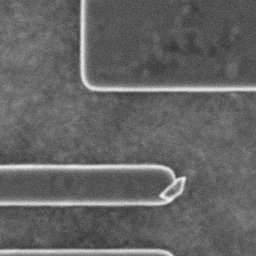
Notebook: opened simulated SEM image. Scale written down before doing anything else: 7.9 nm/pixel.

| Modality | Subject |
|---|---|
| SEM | wiring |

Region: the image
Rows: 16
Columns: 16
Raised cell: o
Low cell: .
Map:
.....ooooooooooo
.....ooooooooooo
.....ooooooooooo
.....ooooooooooo
.....ooooooooooo
......oooooooooo
................
................
................
................
oooooooooo......
ooooooooooo.....
ooooooooooo.....
................
................
................